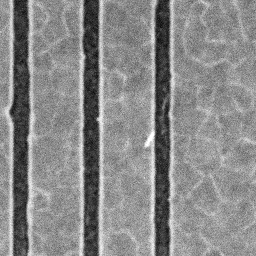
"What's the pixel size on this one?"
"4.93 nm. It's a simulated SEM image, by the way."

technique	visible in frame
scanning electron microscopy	one or a few lines or trenches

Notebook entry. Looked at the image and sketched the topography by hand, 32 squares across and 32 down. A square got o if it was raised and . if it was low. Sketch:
o...oooooo...oooooo..ooooooooooo
o...oooooo...oooooo..ooooooooooo
o...oooooo...oooooo..ooooooooooo
o...oooooo...oooooo..ooooooooooo
o...oooooo...oooooo..ooooooooooo
o...oooooo...oooooo..ooooooooooo
o...oooooo...oooooo..ooooooooooo
o...oooooo...oooooo..ooooooooooo
o...oooooo...oooooo..ooooooooooo
o...oooooo...oooooo...oooooooooo
o...oooooo...oooooo..ooooooooooo
o...oooooo...oooooo...oooooooooo
o...oooooo...oooooo..ooooooooooo
o...oooooo...oooooo..ooooooooooo
o...oooooo...oooooo..ooooooooooo
o...oooooo..ooooooo..ooooooooooo
o...oooooo...oooooo..ooooooooooo
o...oooooo...oooooo...oooooooooo
o...oooooo...oooooo...oooooooooo
o...oooooo...oooooo...oooooooooo
o...oooooo...oooooo..ooooooooooo
o...oooooo...oooooo..ooooooooooo
o...oooooo...oooooo..ooooooooooo
o...oooooo...oooooo..ooooooooooo
o...oooooo...oooooo..ooooooooooo
o...oooooo...oooooo..ooooooooooo
o...oooooo...oooooo..ooooooooooo
o...oooooo...oooooo..ooooooooooo
o...oooooo...oooooo..ooooooooooo
o...oooooo...oooooo..ooooooooooo
o...oooooo...oooooo...oooooooooo
o...oooooo...oooooo..ooooooooooo